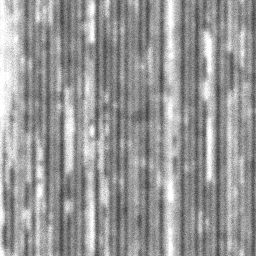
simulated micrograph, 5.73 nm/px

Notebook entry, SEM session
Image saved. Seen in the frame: parallel lines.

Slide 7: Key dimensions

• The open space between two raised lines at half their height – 0.0107 um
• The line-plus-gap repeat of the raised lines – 40.6 nm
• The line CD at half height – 0.0315 micrometres